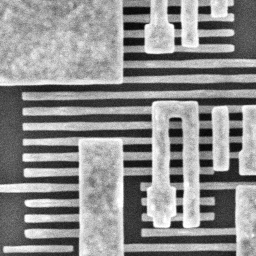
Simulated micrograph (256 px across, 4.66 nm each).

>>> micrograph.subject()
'wiring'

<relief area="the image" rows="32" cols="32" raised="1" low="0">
11111111111111100001100110110000
11111111111111100001100110110000
11111111111111100001100110000000
11111111111111100011110110000000
11111111111111100011110110000000
11111111111111100011110110000000
11111111111111100011100000000000
11111111111111100000000000000000
11111111111111100000000000000000
11111111111111100000000000000000
11111100000000000000000000000000
00000000000000000000000000000000
00000000000000000000000000000000
00000000000000000001111110010011
00000000000000000001111110011011
00000000000000000001100110011011
00000000000000000001100110011011
00000000001111100001100110011011
00000000001111100001100110011011
00000000001111100001100110011011
00000000001111100001100110011011
00000000001111100001100110000011
00000000001111100001100110000000
00000000001111100001110110000011
00000000001111100011110110000011
00000000001111100011110110000011
00000000001111100011110110000011
00000000001111100001100110000011
00000000001111100000000000000011
00000000001111100000000000000011
00000000001111100000000000000011
00000000001111100000000000000011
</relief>